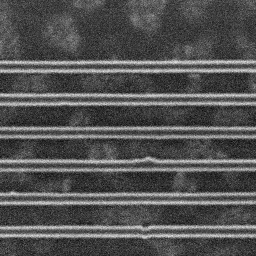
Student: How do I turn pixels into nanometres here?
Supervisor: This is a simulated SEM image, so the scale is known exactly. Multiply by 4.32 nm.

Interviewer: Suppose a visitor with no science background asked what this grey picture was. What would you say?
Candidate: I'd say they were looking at parallel lines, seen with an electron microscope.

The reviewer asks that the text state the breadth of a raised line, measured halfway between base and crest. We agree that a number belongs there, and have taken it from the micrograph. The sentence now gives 40.5 nanometres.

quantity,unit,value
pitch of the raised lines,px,33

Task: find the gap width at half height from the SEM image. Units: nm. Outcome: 101